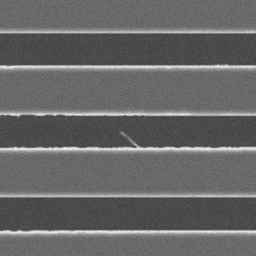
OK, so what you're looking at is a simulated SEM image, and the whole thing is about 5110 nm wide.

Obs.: lines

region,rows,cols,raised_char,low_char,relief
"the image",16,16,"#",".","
################
################
................
................
################
################
################
................
................
################
################
################
................
................
...###..#.######
################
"